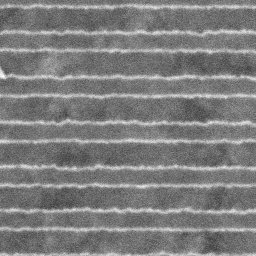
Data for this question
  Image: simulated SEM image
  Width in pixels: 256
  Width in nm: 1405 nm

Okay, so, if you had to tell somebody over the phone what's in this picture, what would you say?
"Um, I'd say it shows lines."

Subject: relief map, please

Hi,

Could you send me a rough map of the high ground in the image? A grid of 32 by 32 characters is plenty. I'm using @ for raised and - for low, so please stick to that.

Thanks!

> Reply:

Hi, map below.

@@@@@@@@@@@@@@@@@@@@@@@@@@@@@@@@
--------------------------------
--------------------------------
--------------------------------
@@@@@@@@@@@@@@@@@@@@@@@@@@@@@@@@
@@@@@@@@@@@@@@@@@@@@@@@@@@@@@@@@
--------------------------@--@@@
--------------------------------
--------------------------------
@@---@----@---@--------@@-----@-
@@@@@@@@@@@@@@@@@@@@@@@@@@@@@@@@
@@@@@@@@@@@@@@@@@@@@@@@@@@@@@@@@
--------------------------------
--------------------------------
--------------------------------
@@@@@@@@@@@@@@@@@@@@@@@@@@@@@@@@
@@@@@@@@@@@@@@@@@@@@@@@@@@@@@@@@
@@@@@@@@@@@@@@@@@@@@@@@@@@@@@@@@
--------------------------------
--------------------------------
--------------------------------
@@@@@@@@@@@@@@@@@@@@@@@@@@@@@@@@
@@@@@@@@@@@@@@@@@@@@@@@@@@@@@@@@
--------------------------------
--------------------------------
--------------------------------
@@@@@@@@@@@@@@@@@@@@-@@@@@@@@@@@
@@@@@@@@@@@@@@@@@@@@@@@@@@@@@@@@
@@@@@@@@@@@@@@@@@@@@@@@@@@@@@@@@
--------------------------------
--------------------------------
--------------------------------